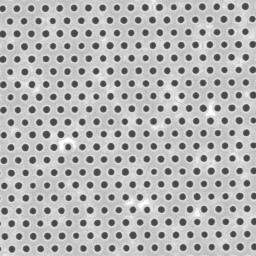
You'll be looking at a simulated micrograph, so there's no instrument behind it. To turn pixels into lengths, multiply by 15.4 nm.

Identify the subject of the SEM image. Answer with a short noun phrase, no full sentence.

a regular array of holes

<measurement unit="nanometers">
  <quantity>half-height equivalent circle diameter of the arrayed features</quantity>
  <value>107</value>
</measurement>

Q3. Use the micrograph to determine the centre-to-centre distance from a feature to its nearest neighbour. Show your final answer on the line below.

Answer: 216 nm